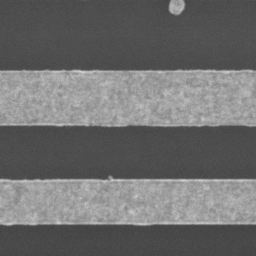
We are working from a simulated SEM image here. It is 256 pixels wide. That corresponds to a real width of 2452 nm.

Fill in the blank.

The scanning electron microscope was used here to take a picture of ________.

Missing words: lines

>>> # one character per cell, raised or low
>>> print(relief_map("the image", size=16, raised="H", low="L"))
LLLLLLLLLLLLLLLL
LLLLLLLLLLLLLLLL
LLLLLLLLLLLLLLLL
LLLLLLLLLLLLLLLL
HHHHHHHHHHHHHHHH
HHHHHHHHHHHHHHHH
HHHHHHHHHHHHHHHH
HHHHHHHHHHHHHHHH
LLLLLLLLLLLLLLLL
LLLLLLLLLLLLLLLL
LLLLLLLLLLLLLLLL
HHHHHHHHHHHHHHHH
HHHHHHHHHHHHHHHH
HHHHHHHHHHHHHHHH
LLLLLLLLLLLLLLLL
LLLLLLLLLLLLLLLL